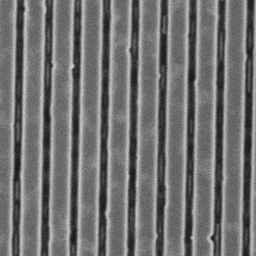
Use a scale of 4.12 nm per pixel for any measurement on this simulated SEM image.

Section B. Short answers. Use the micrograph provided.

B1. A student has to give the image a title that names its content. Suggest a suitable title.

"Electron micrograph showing parallel lines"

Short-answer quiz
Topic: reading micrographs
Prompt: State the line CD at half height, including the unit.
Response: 84 nanometres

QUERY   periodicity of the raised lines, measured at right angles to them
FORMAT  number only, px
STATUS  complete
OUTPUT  28.8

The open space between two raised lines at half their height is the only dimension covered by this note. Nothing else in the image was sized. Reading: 34 nanometres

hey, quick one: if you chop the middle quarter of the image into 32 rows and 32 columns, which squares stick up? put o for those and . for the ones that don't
oo..ooooo..oooooo..oooo...ooooo.
oo..ooooo..oooooo..ooooo..ooooo.
oo..ooooo..ooooo...ooooo..ooooo.
oo..ooooo..ooooo...ooooo..ooooo.
oo..ooooo..ooooo...ooooo..ooooo.
oo..ooooo..ooooo...ooooo..ooooo.
oo..ooooo..ooooo...ooooo..ooooo.
oo..ooooo..ooooo...ooooo..ooooo.
oo..ooooo...oooo...ooooo..ooooo.
oo..ooooo...oooo..oooooo..ooooo.
oo..ooooo..ooooo...ooooo..ooooo.
oo..ooooo..ooooo...oooo...ooooo.
oo..ooooo..ooooo...oooo...ooooo.
oo..ooooo..ooooo...oooo...ooooo.
oo..ooooo..ooooo...oooo...ooooo.
oo..ooooo..ooooo...oooo...ooooo.
oo..ooooo..ooooo...oooo..oooooo.
oo..ooooo..ooooo...oooo...ooooo.
oo..ooooo..ooooo...oooo...ooooo.
oo..ooooo..ooooo..ooooo...ooooo.
oo..ooooo..ooooo..ooooo..ooooo..
oo..ooooo..ooooo..ooooo..ooooo..
oo..ooooo..ooooo..ooooo..ooooo..
oo..ooooo..ooooo..ooooo...oooo..
oo..ooooo..ooooo..ooooo...oooo..
oo..ooooo..ooooo..ooooo...oooo..
o...ooooo..ooooo..ooooo...oooo..
o...ooooo..ooooo..ooooo...oooo..
o...ooooo..ooooo..ooooo..ooooo..
o...ooooo..ooooo..ooooo..ooooo..
o...ooooo..ooooo..ooooo..ooooo..
o...ooooo..ooooo..ooooo...oooo..